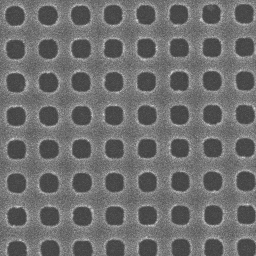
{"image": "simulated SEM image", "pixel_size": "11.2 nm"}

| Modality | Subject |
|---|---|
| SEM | a regular array of holes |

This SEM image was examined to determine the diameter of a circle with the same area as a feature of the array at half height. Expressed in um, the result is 0.229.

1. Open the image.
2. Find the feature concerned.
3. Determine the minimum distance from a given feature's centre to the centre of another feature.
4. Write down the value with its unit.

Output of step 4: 0.365 micrometres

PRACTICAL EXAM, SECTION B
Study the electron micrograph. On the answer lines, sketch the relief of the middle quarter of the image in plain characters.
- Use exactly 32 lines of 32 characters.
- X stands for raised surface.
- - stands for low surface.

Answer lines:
XXXXXXXXXXXXXXXXXXXXXXXXXXXXXXXX
XXXXXXXXXXXXXXXXXXXXXXXXXXXXXXXX
XX----XXXXX---XXXXX----XXXX----X
XX-----XXX-----XXX-----XXX-----X
XX-----XXX-----XXX-----XXX-----X
XX-----XXX-----XXX-----XXXX----X
XX----XXXXX---XXXXX---XXXXX----X
XXXXXXXXXXXXXXXXXXXXXXXXXXXXXXXX
XXXXXXXXXXXXXXXXXXXXXXXXXXXXXXXX
XXXXXXXXXXXXXXXXXXXXXXXXXXXXXXXX
XXX--XXXXXX--XXXXXX---XXXXX---XX
XX-----XXX-----XXX-----XXX-----X
XX-----XXX-----XXX-----XXX-----X
XX-----XXX-----XXX-----XXX-----X
XX-----XXX-----XXXX----XXXX----X
XXXX-XXXXXXX-XXXXXXXXXXXXXXXXXXX
XXXXXXXXXXXXXXXXXXXXXXXXXXXXXXXX
XXXXXXXXXXXXXXXXXXXXXXXXXXXXXXXX
XXXXXXXXXXXXXXXXXXXX-XXXXXXXXXXX
XX----XXXXX----XXXX----XXXX----X
XX-----XXX-----XXXX----XXXX----X
XX-----XXX-----XXX-----XXXX----X
XX-----XXX-----XXXX----XXXX----X
XXX---XXXXX---XXXXXX--XXXXXXX-XX
XXXXXXXXXXXXXXXXXXXXXXXXXXXXXXXX
XXXXXXXXXXXXXXXXXXXXXXXXXXXXXXXX
XXXXXXXXXXXXXXXXXXXXXXXXXXXXXXXX
XXX---XXXXX---XXXXX---XXXXX----X
XX-----XXX-----XXXX----XXXX----X
XX-----XXX-----XXX-----XXXX-----
XX-----XXX-----XXXX----XXXX-----
XX----XXXXX---XXXXX----XXXX----X